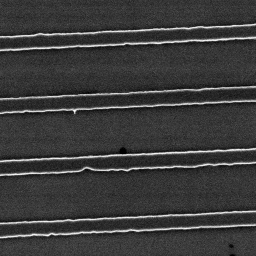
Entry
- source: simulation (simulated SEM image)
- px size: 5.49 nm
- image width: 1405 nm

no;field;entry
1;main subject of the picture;parallel lines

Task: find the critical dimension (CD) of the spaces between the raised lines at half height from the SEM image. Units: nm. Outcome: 264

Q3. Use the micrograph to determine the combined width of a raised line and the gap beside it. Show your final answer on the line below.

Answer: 341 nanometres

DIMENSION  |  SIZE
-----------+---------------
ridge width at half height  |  79.2 nanometers